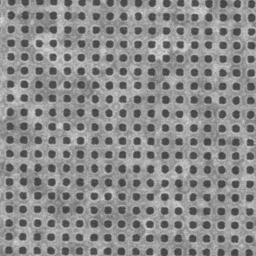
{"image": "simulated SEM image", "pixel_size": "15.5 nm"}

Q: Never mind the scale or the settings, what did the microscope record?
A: a regular array of holes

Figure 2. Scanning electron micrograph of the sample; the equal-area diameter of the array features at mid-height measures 142 nm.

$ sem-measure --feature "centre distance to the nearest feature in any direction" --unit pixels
13.5